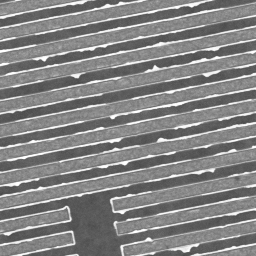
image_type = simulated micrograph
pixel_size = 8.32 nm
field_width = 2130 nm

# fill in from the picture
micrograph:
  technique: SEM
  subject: parallel lines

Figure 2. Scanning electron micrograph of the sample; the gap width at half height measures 11.4 pixels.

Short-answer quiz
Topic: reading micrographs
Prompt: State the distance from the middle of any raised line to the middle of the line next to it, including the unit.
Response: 197 nanometers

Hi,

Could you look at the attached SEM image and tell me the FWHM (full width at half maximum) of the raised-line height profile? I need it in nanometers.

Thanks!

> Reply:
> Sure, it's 100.